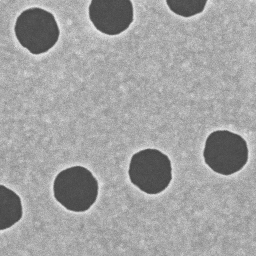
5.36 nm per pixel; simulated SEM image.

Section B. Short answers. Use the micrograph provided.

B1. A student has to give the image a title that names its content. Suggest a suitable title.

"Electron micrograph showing holes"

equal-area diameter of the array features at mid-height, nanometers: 242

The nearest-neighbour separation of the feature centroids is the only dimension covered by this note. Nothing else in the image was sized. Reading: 413 nm